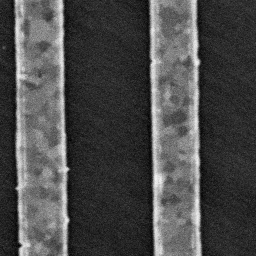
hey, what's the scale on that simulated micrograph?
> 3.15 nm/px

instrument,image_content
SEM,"one or a few lines or trenches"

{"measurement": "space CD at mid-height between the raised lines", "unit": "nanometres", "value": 286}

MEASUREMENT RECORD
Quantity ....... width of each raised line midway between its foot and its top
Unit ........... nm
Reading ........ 138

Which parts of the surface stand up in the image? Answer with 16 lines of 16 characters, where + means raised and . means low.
.+++......++....
.+++......++....
.+++......++....
.+++......++....
.+++......++....
.+++......++....
.+++......++....
.+++......++....
.+++......++....
.+++......++....
.+++......++....
.+++......++....
.+++......++....
.+++......++....
.+++......++....
.+++......++....